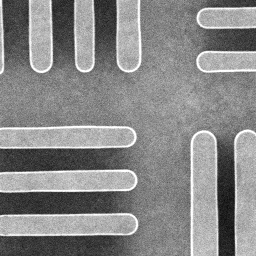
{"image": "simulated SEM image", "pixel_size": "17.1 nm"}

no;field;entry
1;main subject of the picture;groups of lines, slits or small figures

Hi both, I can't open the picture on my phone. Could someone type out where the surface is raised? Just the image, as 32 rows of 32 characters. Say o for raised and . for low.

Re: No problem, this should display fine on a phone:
....oo...ooo...oo...............
....oo...ooo...oo........ooooooo
....oo...ooo...oo........ooooooo
....oo...ooo...oo...............
....oo...ooo...oo...............
....oo...ooo...oo...............
....oo...ooo...oo.........oooooo
....oo...ooo...oo........ooooooo
....oo....o....oo........ooooooo
................................
................................
................................
................................
................................
................................
................................
ooooooooooooooooo........o....oo
ooooooooooooooooo.......ooo..ooo
........................ooo..ooo
........................ooo..ooo
........................ooo..ooo
....ooooooooooooo.......ooo..ooo
ooooooooooooooooo.......ooo..ooo
ooooooooooooooooo.......ooo..ooo
........................ooo..ooo
........................ooo..ooo
........................ooo..ooo
ooooooooooooooooo.......ooo..ooo
ooooooooooooooooo.......ooo..ooo
........................ooo..ooo
........................ooo..ooo
........................ooo..ooo